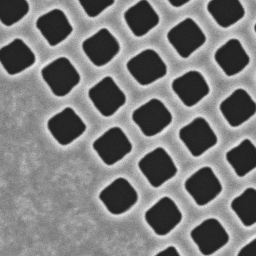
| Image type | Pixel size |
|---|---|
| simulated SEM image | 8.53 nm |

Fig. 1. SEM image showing a regular array of holes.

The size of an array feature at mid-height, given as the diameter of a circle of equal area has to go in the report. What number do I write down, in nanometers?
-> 300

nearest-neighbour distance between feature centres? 0.421 µm